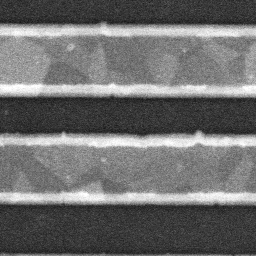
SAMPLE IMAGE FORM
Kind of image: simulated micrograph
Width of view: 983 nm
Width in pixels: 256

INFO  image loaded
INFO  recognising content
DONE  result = one or a few lines or trenches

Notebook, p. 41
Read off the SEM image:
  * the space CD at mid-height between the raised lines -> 192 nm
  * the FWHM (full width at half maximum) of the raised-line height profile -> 228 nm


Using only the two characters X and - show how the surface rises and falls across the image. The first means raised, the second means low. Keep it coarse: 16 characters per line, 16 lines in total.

----------------
----------------
XXXXXXXXXXXXXXXX
XXXXXXXXXXXXXXXX
XXXXXXXXXXXXXXXX
XXXXXXXXXXXXXXXX
----------------
----------------
----------------
XXXXXXXXXXXXXXXX
XXXXXXXXXXXXXXXX
XXXXXXXXXXXXXXXX
----------------
----------------
----------------
----------------